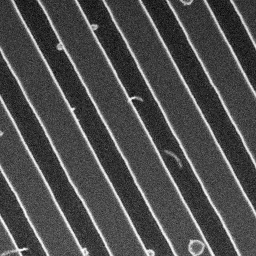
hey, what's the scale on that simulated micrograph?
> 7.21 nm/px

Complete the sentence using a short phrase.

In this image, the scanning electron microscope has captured lines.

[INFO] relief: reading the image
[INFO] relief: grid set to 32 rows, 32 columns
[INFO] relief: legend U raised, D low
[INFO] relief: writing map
UUDDDUUUUUDDDUUUUUDDDUUUUUDDDUUU
UUDDDDUUUUDDDDUUUUDDDDUUUUDDDDUU
UUUDDDUUUUUDDDUUUUUDDDUUUUUDDDUU
UUUDDDDUUUUDDDDUUUUDDDDUUUUDDDDU
UUUUDDDUUUUUDDDUUUUUDDDUUUUUDDDU
UUUUUDDDUUUUDDDDUUUUUDDDUUUUUDDD
UUUUUDDDUUUUUDDDUUUUUDDDUUUUUDDD
DUUUUUDDDUUUUUDDDUUUUUDDDUUUUUDD
DUUUUUDDDUUUUUDDDUUUUUDDDUUUUUDD
DDUUUUUDDDUUUUUDDDUUUUUDDDUUUUUD
DDUUUUUDDDUUUUUDDDUUUUUDDDUUUUUD
DDDUUUUUDDDUUUUUDDDUUUUUDDDUUUUU
DDDUUUUUDDDUUUUUDDDUUUUUDDDDUUUU
UDDDUUUUUDDDUUUUUDDDUUUUUDDDUUUU
UDDDDUUUUDDDDUUUUDDDDUUUUDDDDUUU
UUDDDUUUUUDDDUUUUUDDDUUUUUDDDUUU
UUDDDDUUUUDDDDUUUUDDDDUUUUDDDDUU
UUUDDDUUUUUDDDUUUUUDDDUUUUUDDDUU
UUUDDDDUUUUDDDDUUUUDDDDUUUUUDDDU
UUUUDDDUUUUUDDDUUUUUDDDUUUUUDDDU
UUUUUDDDUUUUUDDDUUUUDDDDUUUUUDDD
UUUUUDDDUUUUUDDDUUUUUDDDUUUUUDDD
DUUUUUDDDUUUUUDDDUUUUUDDDUUUUUDD
DUUUUUDDDUUUUUDDDUUUUUDDDUUUUUDD
DDUUUUUDDDUUUUUDDDUUUUUDDDUUUUUD
DDUUUUUDDDUUUUUDDDUUUUUDDDUUUUUD
DDDUUUUUDDDUUUUUDDDUUUUUDDDUUUUU
DDDDUUUUDDDDUUUUDDDUUUUUDDDDUUUU
UDDDUUUUUDDDUUUUUDDDUUUUUDDDUUUU
UDDDDUUUUDDDDUUUUDDDDUUUUDDDDUUU
UUDDDUUUUUDDDUUUUUDDDUUUUUDDDUUU
UUUDDDUUUUDDDDUUUUDDDDUUUUDDDDUU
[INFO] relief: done